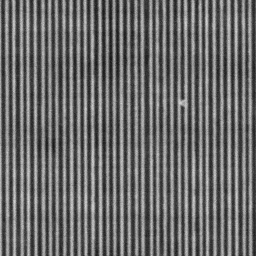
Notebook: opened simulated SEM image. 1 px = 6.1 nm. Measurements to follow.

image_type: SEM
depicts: parallel lines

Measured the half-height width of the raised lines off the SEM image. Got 13.7 nm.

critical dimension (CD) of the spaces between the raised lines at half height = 4.62 px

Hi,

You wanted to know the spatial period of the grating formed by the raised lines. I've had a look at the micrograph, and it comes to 0.0436 micrometres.